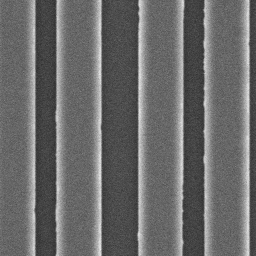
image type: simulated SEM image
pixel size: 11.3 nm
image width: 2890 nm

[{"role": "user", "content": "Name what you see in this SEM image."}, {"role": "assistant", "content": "lines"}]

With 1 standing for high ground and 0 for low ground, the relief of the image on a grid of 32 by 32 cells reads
11110001111110000111111000111110
11110001111110000111111000111110
11110001111110000111111000111110
11110001111110000111111000111110
11110001111110000111111000111110
11110001111110000111111000111110
11110001111110000111111000111110
11110001111110000111111000111110
11110001111110000111111000111110
11110001111110000111111000111110
11110001111110000111111000111110
11110001111110000111111000111110
11110001111110000111111000111110
11110001111110000111111000111110
11110001111110000111111000111110
11110001111110000111111000111110
11110001111110000111111000111110
11110001111110000111111000111110
11110001111110000111111000111110
11110001111110000111111000111110
11110001111110000111111000111110
11110001111110000111111000111110
11110001111110000111111000111110
11110001111110000111111000111110
11110001111110000111111000111110
11110001111110000111111000111110
11110001111110000111111000111110
11110001111110000111111000111110
11110001111110000111111000111110
11110001111110000111111000111110
11110001111110000111111000111110
11110001111110000111111000111110